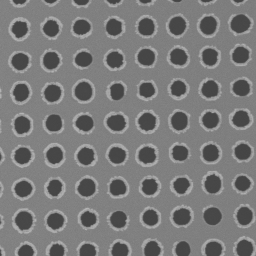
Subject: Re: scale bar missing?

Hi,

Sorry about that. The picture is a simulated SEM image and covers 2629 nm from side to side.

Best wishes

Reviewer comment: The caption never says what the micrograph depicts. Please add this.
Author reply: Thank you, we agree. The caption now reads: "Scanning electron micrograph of a regular array of holes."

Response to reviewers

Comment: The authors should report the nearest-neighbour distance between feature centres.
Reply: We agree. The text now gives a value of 318 nm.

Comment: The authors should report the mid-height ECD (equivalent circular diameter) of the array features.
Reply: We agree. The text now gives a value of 173 nanometres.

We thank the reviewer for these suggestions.